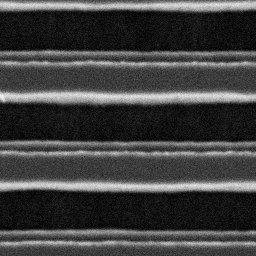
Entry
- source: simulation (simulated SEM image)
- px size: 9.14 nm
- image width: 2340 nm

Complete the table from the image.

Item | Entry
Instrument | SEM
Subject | lines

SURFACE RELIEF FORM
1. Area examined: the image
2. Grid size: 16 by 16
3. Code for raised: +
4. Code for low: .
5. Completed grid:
.............+..
................
................
++++++++++++++++
++++++++++++++++
++++++++++++++++
................
................
................
++++++++++++++++
++++++++++++++++
++++++++++++++++
................
................
+++............+
++++++++++++++++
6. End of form